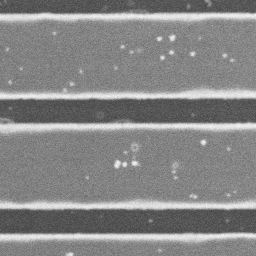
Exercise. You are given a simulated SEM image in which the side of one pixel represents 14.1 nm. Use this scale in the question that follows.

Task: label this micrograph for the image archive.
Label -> lines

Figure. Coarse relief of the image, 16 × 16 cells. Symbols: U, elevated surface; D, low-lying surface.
DDDDDDDDDDDDDDDD
UUUUUUUUUUUUUUUU
UUUUUUUUUUUUUUUU
UUUUUUUUUUUUUUUU
UUUUUUUUUUUUUUUU
UUUUUUUUUUUUUUUU
DDDDDDDDDDDDDDDD
DDDDDDDDDDDDDDDD
UUUUUUUUUUUUUUUU
UUUUUUUUUUUUUUUU
UUUUUUUUUUUUUUUU
UUUUUUUUUUUUUUUU
UUUUUUUUUUUUUUUU
DDDDDDDDDDDDDDDD
DDDDDDDDDDDDDDDD
UUUUUUUUUUUUUUUU